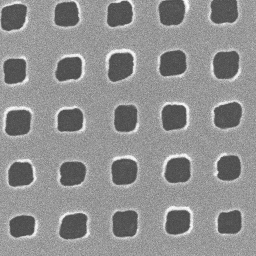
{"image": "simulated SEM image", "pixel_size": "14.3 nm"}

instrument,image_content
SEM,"a regular array of holes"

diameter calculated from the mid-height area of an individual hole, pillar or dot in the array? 0.38 microns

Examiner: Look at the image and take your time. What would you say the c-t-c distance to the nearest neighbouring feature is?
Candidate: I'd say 51.5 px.